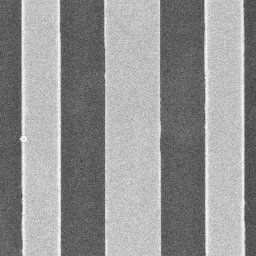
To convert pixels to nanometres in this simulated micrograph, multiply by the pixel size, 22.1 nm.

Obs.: lines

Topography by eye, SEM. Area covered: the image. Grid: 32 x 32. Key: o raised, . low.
...oooo......ooooooo......oooo..
...oooo......ooooooo......oooo..
...oooo......ooooooo......oooo..
...oooo......ooooooo......oooo..
...oooo......ooooooo......oooo..
...ooooo.....ooooooo......oooo..
...ooooo.....ooooooo......oooo..
...ooooo.....ooooooo......oooo..
...ooooo.....ooooooo......oooo..
...ooooo.....ooooooo......oooo..
...ooooo.....ooooooo......oooo..
...ooooo.....ooooooo......oooo..
...ooooo.....ooooooo......oooo..
...ooooo.....ooooooo......oooo..
...ooooo.....ooooooo......oooo..
...ooooo.....ooooooo......oooo..
...ooooo.....ooooooo......oooo..
...ooooo.....ooooooo......oooo..
...ooooo.....ooooooo......oooo..
...ooooo.....ooooooo......oooo..
...ooooo.....ooooooo......oooo..
...ooooo.....ooooooo......oooo..
...ooooo.....ooooooo......oooo..
...ooooo.....ooooooo......oooo..
...ooooo.....ooooooo......oooo..
...ooooo.....ooooooo......oooo..
...ooooo.....ooooooo......oooo..
...ooooo.....ooooooo......oooo..
...ooooo.....ooooooo......ooooo.
...ooooo.....ooooooo......ooooo.
...ooooo.....ooooooo......oooo..
...ooooo.....ooooooo......ooooo.